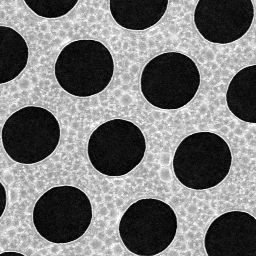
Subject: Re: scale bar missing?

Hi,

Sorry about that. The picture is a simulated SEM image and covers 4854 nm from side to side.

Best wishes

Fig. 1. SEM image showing holes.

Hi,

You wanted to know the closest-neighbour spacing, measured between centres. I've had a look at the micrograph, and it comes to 1630 nanometres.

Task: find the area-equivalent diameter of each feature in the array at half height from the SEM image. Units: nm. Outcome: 1110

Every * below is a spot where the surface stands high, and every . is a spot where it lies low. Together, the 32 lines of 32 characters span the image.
***.......****.......****.......
****.....*****.......***........
**************......****........
.***************...******......*
...**********************.....**
...******....*******************
....****......******************
...****.......*****.....********
...****.......****.......******.
..*****.......****.......****...
*******.......****.......****...
********.....*****.......***....
******************......****....
***..***************..*******...
*......**********************...
*......******....***************
........****......*******.******
.......****.......*****.....****
*......****.......****.......***
*.....*****.......****.......***
***.*******......*****.......***
*************...******.......***
**********************......****
.******...**************..******
.****......*********************
.***.......******....***********
****........****......*******..*
****.......****.......*****.....
****.......****.......****......
*****.....*****.......****......
***************......*****......
*.**************....******......